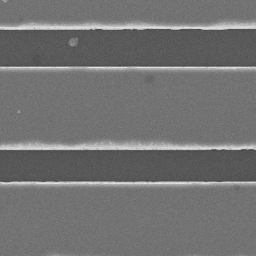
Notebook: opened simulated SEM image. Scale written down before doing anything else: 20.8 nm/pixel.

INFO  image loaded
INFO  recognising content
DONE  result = lines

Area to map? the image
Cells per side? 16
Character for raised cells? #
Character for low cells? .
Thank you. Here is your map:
################
################
................
................
################
################
################
################
################
................
................
################
################
################
################
################